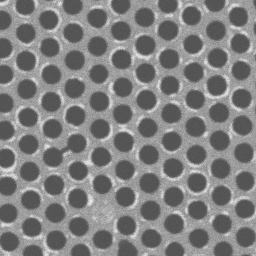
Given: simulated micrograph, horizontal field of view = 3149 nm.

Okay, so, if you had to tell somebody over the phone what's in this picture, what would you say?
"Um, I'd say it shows a regular array of holes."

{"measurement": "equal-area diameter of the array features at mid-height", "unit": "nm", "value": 252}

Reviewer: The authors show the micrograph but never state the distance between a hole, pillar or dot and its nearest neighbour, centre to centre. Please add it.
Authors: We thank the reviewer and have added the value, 330 nm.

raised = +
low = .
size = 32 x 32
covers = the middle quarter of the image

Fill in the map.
+....++...++.....++...++....++..
++..++.....+++.+++.....+++++++..
++++++.....+++++++.....+++++++..
++.+++.....++...++.....++...++..
.....++...+++....++...++.....+++
.....+++++++.....+++++++.....+++
.....+++++++.....+++.+++.....+++
+....++...+++....++....++...+++.
++..++.....+++++++.....+++++++..
++++++.....+++++++.....+++++++..
++..+++....++...++.....++....++.
+....++...++.....+++.+++.....+++
.....+++++++.....+++++++.....+++
.....+++++++.....+++..++.....++.
+....++....++...+++....++...++..
+++.+++....+++++++.....+++++++..
++++++......++++++......++++++..
++..+++....++...+++....++....++.
+....+++..++.....+++++++.....+++
+.....++++++......++++++......++
......+++++++....+++..+++....+++
.....++....++....++....+++..+++.
+++++++.....+++++++.....++++++..
+++++++.....+++++++.....+++.+++.
++..+++.....++...+++...++....++.
+.....++..+++.....+++++++.....++
+.....+++++++.....+++++++.....++
+.....+++++++.....++...++....+++
++...+++...+++...++.....+++.+++.
+++++++.....+++++++.....+++++++.
+++++++.....+++++++.....+++++++.
++...++.....+....++....++....+++